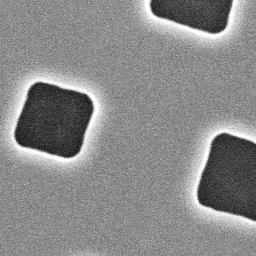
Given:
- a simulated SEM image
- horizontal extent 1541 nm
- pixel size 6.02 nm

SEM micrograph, holes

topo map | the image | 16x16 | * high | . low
*********......*
***********...**
****************
****************
****************
**..************
*.....**********
*.....**********
*....*********.*
***..********...
*************...
************....
************....
***************.
****************
****************